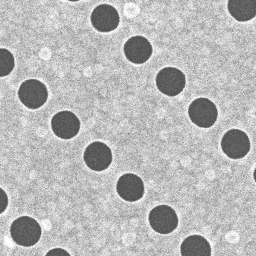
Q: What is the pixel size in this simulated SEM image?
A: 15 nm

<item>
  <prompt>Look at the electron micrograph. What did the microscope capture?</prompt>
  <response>a regular array of holes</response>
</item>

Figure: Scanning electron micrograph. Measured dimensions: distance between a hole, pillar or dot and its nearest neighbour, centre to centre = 675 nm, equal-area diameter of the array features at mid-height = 450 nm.